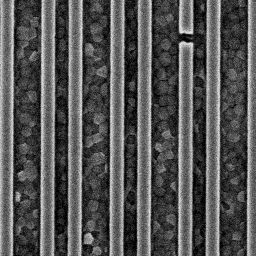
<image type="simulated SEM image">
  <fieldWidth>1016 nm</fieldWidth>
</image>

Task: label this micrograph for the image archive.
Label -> parallel lines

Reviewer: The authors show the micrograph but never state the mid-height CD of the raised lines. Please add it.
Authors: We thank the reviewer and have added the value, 53.6 nm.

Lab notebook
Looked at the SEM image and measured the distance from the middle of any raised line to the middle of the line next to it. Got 0.132 µm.